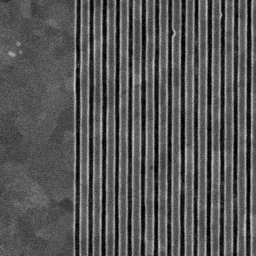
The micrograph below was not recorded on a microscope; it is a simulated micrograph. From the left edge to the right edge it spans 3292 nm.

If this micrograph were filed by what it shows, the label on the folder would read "parallel lines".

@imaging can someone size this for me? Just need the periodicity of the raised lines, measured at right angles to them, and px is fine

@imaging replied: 13.1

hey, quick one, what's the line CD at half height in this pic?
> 106 nm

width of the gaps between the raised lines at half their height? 59.5 nm